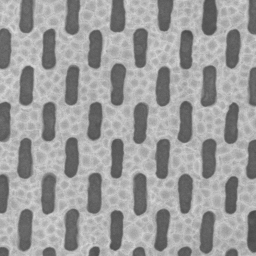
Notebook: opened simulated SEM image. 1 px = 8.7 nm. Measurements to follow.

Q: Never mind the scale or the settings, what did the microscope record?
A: a regular array of holes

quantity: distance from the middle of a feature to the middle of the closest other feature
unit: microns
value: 0.367